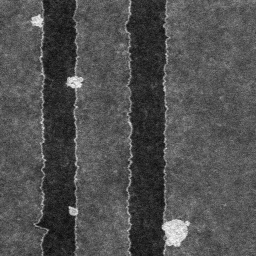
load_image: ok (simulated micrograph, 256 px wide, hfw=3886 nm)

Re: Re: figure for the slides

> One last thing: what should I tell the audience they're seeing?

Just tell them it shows one or a few lines or trenches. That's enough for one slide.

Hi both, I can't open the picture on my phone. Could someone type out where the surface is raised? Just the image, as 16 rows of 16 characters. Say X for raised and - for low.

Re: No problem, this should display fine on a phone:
---XX---XX------
--XXX---XX------
---XX---XX------
---XX---XX------
---XX---XX------
---XX---XX------
---XX---XX------
---XX---XX------
---XX---XX------
---XX---XX------
---XX---XX------
---XX---XX------
---XX---XX------
---XX---XX------
---XX---XXXX----
---XX---XXX-----